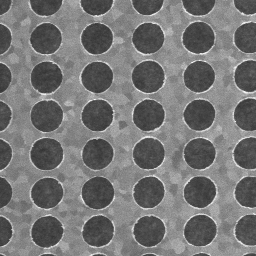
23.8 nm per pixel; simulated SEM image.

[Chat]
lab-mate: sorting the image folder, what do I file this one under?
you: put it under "a regular array of holes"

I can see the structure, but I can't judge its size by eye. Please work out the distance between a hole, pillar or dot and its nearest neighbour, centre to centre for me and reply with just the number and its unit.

0.916 microns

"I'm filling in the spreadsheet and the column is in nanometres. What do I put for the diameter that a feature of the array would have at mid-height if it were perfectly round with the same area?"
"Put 767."